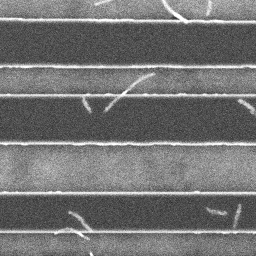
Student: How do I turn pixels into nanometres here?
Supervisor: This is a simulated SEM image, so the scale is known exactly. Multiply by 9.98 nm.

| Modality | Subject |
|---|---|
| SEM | lines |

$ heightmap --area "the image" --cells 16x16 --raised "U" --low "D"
DDDDDDDDDDDDDDDD
UUUUUUUUUUUUUUUU
UUUUUUUUUUUUUUUU
UUUUUUUUUUUUUUUU
DDDDDDDDDDDDDDDD
DDDDDDDDDDDDDDDD
UUUUUUUUUUUUUUUU
UUUUUUUUUUUUUUUU
UUUUUUUUUUUUUUUU
DDDDDDDDDDDDDDDD
DDDDDDDDDDDDDDDD
DDDDDDDDDDDDDDDD
UUUUUUUUUUUUUUUU
UUUUUUUUUUUUUUUU
DDDUUUDDDDDDUUUU
DDDDDDDDDDDDDDDD